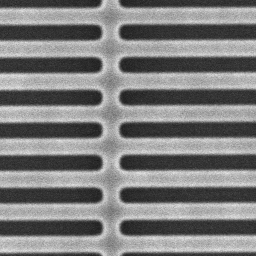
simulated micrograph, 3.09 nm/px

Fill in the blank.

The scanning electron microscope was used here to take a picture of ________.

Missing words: groups of lines, slits or small figures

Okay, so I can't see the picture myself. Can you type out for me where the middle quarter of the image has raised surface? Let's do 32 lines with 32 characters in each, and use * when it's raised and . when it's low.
..........****..................
.........*****..................
********************************
********************************
********************************
********************************
........*******.................
..........****..................
..........****..................
..........****..................
........********....************
********************************
********************************
********************************
........*******.................
..........****..................
..........****..................
..........****..................
........*******.................
********************************
********************************
********************************
****************................
..........****..................
..........****..................
..........****..................
.........*****..................
********************************
********************************
********************************
*****************************...
..........****..................